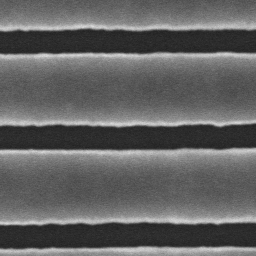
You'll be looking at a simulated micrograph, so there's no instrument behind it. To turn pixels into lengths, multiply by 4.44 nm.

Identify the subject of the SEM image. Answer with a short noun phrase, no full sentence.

lines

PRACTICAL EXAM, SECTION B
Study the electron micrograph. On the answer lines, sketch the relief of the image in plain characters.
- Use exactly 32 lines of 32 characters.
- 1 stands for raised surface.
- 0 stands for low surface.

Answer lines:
11111111111111111111111111111111
11111111111111111111111111111111
11111111111111111111111111111111
11111111111111111111111111111111
00000000000000000000000000000000
00000000000000000000000000000000
00000000000000000000000000000000
11111111111111111111111111111111
11111111111111111111111111111111
11111111111111111111111111111111
11111111111111111111111111111111
11111111111111111111111111111111
11111111111111111111111111111111
11111111111111111111111111111111
11111111111111111111111111111111
11111111111111111111111111111110
00000000000000000000000000000000
00000000000000000000000000000000
00000000000000000000000000000000
11111111111111111111111111111111
11111111111111111111111111111111
11111111111111111111111111111111
11111111111111111111111111111111
11111111111111111111111111111111
11111111111111111111111111111111
11111111111111111111111111111111
11111111111111111111111111111111
11111111111111111111111111111111
00000000000000000000000000000000
00000000000000000000000000000000
00000000000000000000000000000000
11111111111111111111111111111111